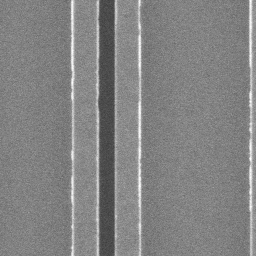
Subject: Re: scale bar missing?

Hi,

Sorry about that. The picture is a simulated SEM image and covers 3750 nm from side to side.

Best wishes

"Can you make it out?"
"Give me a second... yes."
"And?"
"lines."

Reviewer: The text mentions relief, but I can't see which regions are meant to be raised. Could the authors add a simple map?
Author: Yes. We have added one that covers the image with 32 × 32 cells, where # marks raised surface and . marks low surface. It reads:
.........###..###..............#
.........###..###..............#
.........###..###..............#
.........###..###..............#
.........###..###..............#
.........###..###..............#
.........###..###..............#
.........###..###..............#
.........###..###..............#
.........###..###..............#
.........###..###..............#
.........###..###..............#
.........###..###..............#
.........###..###..............#
.........###..###..............#
.........###..###..............#
.........###..###..............#
.........###..###..............#
.........###..###..............#
.........###..###..............#
.........###..###..............#
.........###..###..............#
.........###..###..............#
.........###..###..............#
.........###..###..............#
.........###..###..............#
.........###..###..............#
.........###..###..............#
.........###..###..............#
.........###..###..............#
.........###..###..............#
.........###..###..............#